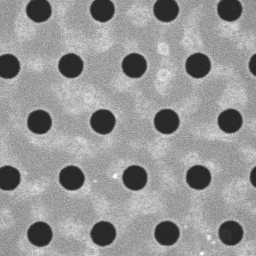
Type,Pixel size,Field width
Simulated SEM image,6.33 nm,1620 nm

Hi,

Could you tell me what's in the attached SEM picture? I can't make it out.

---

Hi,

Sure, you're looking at a regular array of holes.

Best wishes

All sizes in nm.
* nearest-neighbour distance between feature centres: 401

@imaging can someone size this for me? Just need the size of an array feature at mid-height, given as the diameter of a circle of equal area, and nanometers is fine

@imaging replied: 160